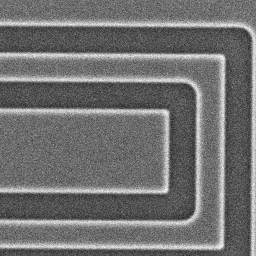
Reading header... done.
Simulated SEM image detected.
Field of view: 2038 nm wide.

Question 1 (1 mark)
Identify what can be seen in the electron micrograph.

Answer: groups of lines, slits or small figures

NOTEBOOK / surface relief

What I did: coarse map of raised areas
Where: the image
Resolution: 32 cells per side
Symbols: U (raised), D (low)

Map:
UUUUUUUUUUUUUUUUUUUUUUUUUUUUUUUU
UUUUUUUUUUUUUUUUUUUUUUUUUUUUUUUU
UUUUUUUUUUUUUUUUUUUUUUUUUUUUUUUU
DDDDDDDDDDDDDDDDDDDDDDDDDDDDDDDU
DDDDDDDDDDDDDDDDDDDDDDDDDDDDDDDD
DDDDDDDDDDDDDDDDDDDDDDDDDDDDDDDD
DDDDDDDDDDDDDDDDDDDDDDDDDDDDDDDD
UUUUUUUUUUUUUUUUUUUUUUUUUUUUDDDD
UUUUUUUUUUUUUUUUUUUUUUUUUUUUDDDD
UUUUUUUUUUUUUUUUUUUUUUUUUUUUDDDD
DDDDDDDDDDDDDDDDDDDDDDDDUUUUDDDD
DDDDDDDDDDDDDDDDDDDDDDDDDUUUDDDD
DDDDDDDDDDDDDDDDDDDDDDDDDUUUDDDD
DDDDDDDDDDDDDDDDDDDDDDDDDUUUDDDD
UUUUUUUUUUUUUUUUUUUUUDDDDUUUDDDD
UUUUUUUUUUUUUUUUUUUUUDDDDUUUDDDD
UUUUUUUUUUUUUUUUUUUUUDDDDUUUDDDD
UUUUUUUUUUUUUUUUUUUUUDDDDUUUDDDD
UUUUUUUUUUUUUUUUUUUUUDDDDUUUDDDD
UUUUUUUUUUUUUUUUUUUUUDDDDUUUDDDD
UUUUUUUUUUUUUUUUUUUUUDDDDUUUDDDD
UUUUUUUUUUUUUUUUUUUUUDDDDUUUDDDD
UUUUUUUUUUUUUUUUUUUUUDDDDUUUDDDD
UUUUUUUUUUUUUUUUUUUUUDDDDUUUDDDD
DDDDDDDDDDDDDDDDDDDDDDDDDUUUDDDD
DDDDDDDDDDDDDDDDDDDDDDDDDUUUDDDD
DDDDDDDDDDDDDDDDDDDDDDDDUUUUDDDD
DDDDDDDDDDDDDDDDDDDDDDDUUUUUDDDD
UUUUUUUUUUUUUUUUUUUUUUUUUUUUDDDD
UUUUUUUUUUUUUUUUUUUUUUUUUUUUDDDD
UUUUUUUUUUUUUUUUUUUUUUUUUUUUDDDD
DDDDDDDDDDDDDDDDDDDDDDDDDDDDDDDD